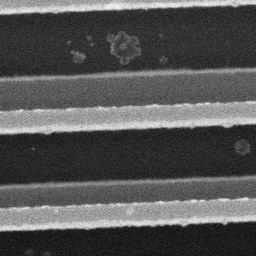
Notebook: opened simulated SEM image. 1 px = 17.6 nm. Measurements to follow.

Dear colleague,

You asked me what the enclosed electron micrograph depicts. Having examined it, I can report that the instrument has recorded lines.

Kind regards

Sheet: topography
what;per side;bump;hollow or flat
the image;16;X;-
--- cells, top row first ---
XXXXXXXXX-------
----------------
----------------
----------------
--------------XX
XXXXXXXXXXXXXXXX
XXXXXXXXXXXXXXXX
XXXXXXXXXXXXXXXX
----------------
----------------
----------------
------XXXXXXXXXX
XXXXXXXXXXXXXXXX
XXXXXXXXXXXXXXXX
----------------
----------------